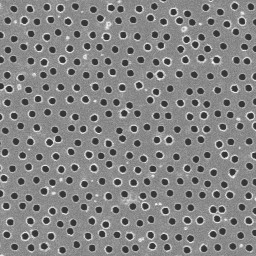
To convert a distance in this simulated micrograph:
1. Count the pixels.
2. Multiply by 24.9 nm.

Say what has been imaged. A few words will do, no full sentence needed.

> a regular array of holes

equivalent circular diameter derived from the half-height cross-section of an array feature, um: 0.169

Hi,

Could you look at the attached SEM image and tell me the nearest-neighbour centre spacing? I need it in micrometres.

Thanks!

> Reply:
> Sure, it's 0.314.